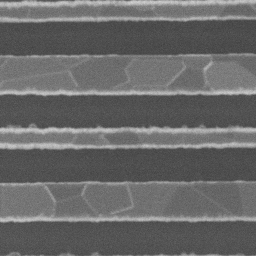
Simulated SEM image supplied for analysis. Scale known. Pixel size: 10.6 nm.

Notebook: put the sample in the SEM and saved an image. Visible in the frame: lines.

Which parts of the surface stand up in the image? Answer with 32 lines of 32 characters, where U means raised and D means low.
UUUUUUUUUUUUUUUUUUUUUUUUUUUUUUUU
UUUUUUUUUUUUUUUUUUUUUUUUUUUUUUUU
DUUUUUDDDDDDDDDDDDDDDDDDDDDDDDDD
DDDDDDDDDDDDDDDDDDDDDDDDDDDDDDDD
DDDDDDDDDDDDDDDDDDDDDDDDDDDDDDDD
DDDDDDDDDDDDDDDDDDDDDDDDDDDDDDDD
DDDDDDDDDDDDDDDDDDDDDDDDDDDDDDDD
UUUUUUUUUUUUUUUUUUUUUUUUUUUUUUUU
UUUUUUUUUUUUUUUUUUUUUUUUUUUUUUUU
UUUUUUUUUUUUUUUUUUUUUUUUUUUUUUUU
UUUUUUUUUUUUUUUUUUUUUUUUUUUUUUUU
UUUUUUUUUUUUUUUUUUUUUUUUUUUUUUUU
DDDDDDDDDDDDDDDDDDDDDDDDDDDDDDDD
DDDDDDDDDDDDDDDDDDDDDDDDDDDDDDDD
DDDDDDDDDDDDDDDDDDDDDDDDDDDDDDDD
DDDDDDDDDDDDDDDDDDDDDDDDDDDDDDDD
UUUUUUUUUUUUUUUUUUUUUUUUUUUUUUUU
UUUUUUUUUUUUUUUUUUUUUUUUUUUUUUUU
DDDDDDDDDDDDDDDDDDDDDDDDDDDDDDDD
DDDDDDDDDDDDDDDDDDDDDDDDDDDDDDDD
DDDDDDDDDDDDDDDDDDDDDDDDDDDDDDDD
DDDDDDDDDDDDDDDDDDDDDDDDDDDDDDDD
DDDDDDDDDDDDDDDDDDDDDDDDDDDDDDDD
UUUUUUUUUUUUUUUUUUUUUUUUUUUUUUUU
UUUUUUUUUUUUUUUUUUUUUUUUUUUUUUUU
UUUUUUUUUUUUUUUUUUUUUUUUUUUUUUUU
UUUUUUUUUUUUUUUUUUUUUUUUUUUUUUUU
UUUUUUUUUUUUUUUUUUUUUUUUUUUUDUUU
DDDDDDDDDDDDDDDDDDDDDDDDDDDDDDDD
DDDDDDDDDDDDDDDDDDDDDDDDDDDDDDDD
DDDDDDDDDDDDDDDDDDDDDDDDDDDDDDDD
DDDDDDDDDDDDDDDDDDDDDDDDDDDDDDDD